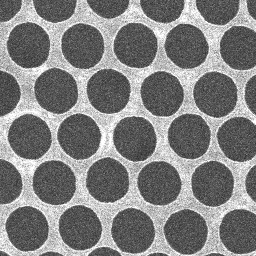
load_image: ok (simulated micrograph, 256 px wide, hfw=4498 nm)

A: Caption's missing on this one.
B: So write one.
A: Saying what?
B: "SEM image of a regular array of holes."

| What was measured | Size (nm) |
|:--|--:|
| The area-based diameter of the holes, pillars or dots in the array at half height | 790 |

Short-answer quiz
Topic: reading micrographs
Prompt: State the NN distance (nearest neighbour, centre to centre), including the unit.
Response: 0.898 µm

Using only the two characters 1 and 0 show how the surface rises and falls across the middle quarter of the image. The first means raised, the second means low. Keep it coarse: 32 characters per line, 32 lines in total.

11000000111111110000011111110000
11111111100001111111111111111111
00111110000000011111100000011111
00011100000000001111000000001111
00011100000000001111000000000111
00011100000000000110000000000011
00011100000000000110000000000011
00001100000000000110000000000011
00011100000000000110000000000011
00011100000000001110000000000011
00011110000000001111000000000111
01111111000000011111100000000111
11100111111111111111110000011100
10000001111111100000111111110000
00000000111111000000001111100000
00000000011110000000001111000000
00000000011110000000000111000000
00000000011100000000000111000000
00000000011100000000000111000000
00000000011100000000000111000000
00000000011110000000000111000000
00000000111110000000000111100000
10000000111111000000001111110000
11000011100011100000011111111100
11111111000000111111100001111111
01111110000000011111000000011111
00111100000000001110000000001111
00011100000000001110000000000111
00011100000000001100000000000111
00011000000000001100000000000111
00011000000000000100000000000011
00011100000000001110000000000111